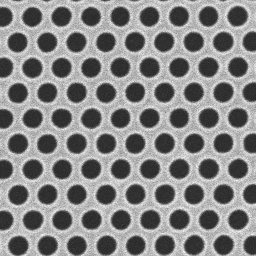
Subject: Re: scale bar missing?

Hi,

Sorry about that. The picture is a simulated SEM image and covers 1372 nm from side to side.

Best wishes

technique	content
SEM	a regular array of holes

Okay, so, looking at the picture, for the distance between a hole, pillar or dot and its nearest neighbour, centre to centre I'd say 29.1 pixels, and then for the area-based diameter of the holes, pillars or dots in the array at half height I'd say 109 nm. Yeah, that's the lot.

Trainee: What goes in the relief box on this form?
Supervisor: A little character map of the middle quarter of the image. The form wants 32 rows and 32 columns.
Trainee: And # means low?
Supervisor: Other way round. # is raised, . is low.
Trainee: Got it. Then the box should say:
..##.....###.....##.....##......
..##.....###....###.....##.....#
.####....###....###....####....#
################################
################################
#....####...####....###....####.
#.....##.....##.....###.....##..
#.....##.....##.....###.....##..
#....###.....###....###....###..
##..#####...#####..#####..#####.
################################
.####...#####...####...####...##
..###....###....###.....###....#
..##.....###.....##.....##.....#
..##.....###.....##.....###....#
.####....###....####...####...##
################################
##..######.######..#####..######
#....####....###....###....###..
#.....##.....##.....###.....##..
#.....##.....##.....###.....##..
#....####...####....###....###..
###.######.######.##############
################################
.####....###....####...####....#
..##.....###.....##.....##.....#
..##.....###.....##.....##.....#
..##.....###....###.....##.....#
.####...#####..#####...#####..##
################################
##..#####...#####..#####...####.
#....###.....###....###.....##..